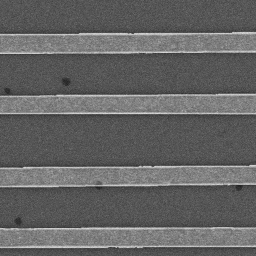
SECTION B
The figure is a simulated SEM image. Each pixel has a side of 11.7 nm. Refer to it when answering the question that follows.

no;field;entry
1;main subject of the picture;lines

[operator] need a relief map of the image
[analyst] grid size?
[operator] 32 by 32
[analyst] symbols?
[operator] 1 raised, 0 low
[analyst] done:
00000000000000000000000000000000
00000000000000000000000000000000
00000000000000000000000000000000
00000000000000000000000000000000
11111111111111111111111111111111
11111111111111111111111111111111
11111111111111110000000000000000
00000000000000000000000000000000
00000000000000000000000000000000
00000000000000000000000000000000
00000000000000000000000000000000
00000000000000000000000000000000
11111111111111111111111111111111
11111111111111111111111111111111
00000000000000000000000000000000
00000000000000000000000000000000
00000000000000000000000000000000
00000000000000000000000000000000
00000000000000000000000000000000
00000000000000000000000000000000
00000000000000000000000000000000
11111111111111111111111111111111
11111111111111111111111111111111
00000000000000000000000000000000
00000000000000000000000000000000
00000000000000000000000000000000
00000000000000000000000000000000
00000000000000000000000000000000
00000000000000000000000000000000
11111111111111111111111111111111
11111111111111111111111111111111
00000000000000000000000000000000